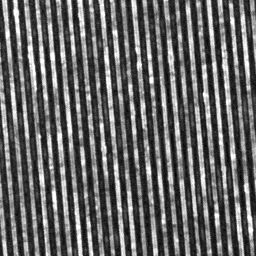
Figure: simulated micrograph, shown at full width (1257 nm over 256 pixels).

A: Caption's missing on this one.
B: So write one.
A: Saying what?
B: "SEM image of parallel lines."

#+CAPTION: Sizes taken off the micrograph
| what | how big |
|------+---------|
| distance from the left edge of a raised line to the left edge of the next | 52.6 nm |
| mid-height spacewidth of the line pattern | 35.5 nm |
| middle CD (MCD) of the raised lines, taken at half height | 15.9 nm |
